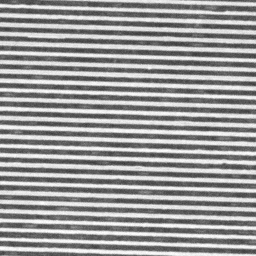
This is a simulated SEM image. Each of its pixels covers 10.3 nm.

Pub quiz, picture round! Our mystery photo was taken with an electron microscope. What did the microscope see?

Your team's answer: parallel lines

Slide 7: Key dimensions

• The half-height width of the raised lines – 3 pixels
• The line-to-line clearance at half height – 69.7 nanometres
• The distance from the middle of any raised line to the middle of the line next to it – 96.3 nanometres